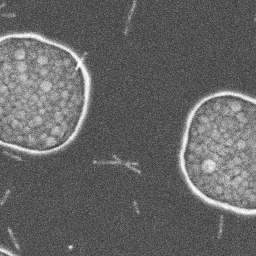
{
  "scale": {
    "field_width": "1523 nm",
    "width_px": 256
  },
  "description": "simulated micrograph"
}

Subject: holes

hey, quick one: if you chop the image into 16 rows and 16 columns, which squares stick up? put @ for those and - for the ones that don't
@@@@@@@@@@@@@@@@
@@@@@@@@@@@@@@@@
---@@@@@@@@@@@@@
-----@@@@@@@@@@@
-----@@@@@@@@@@@
-----@@@@@@@@@@@
-----@@@@@@@@---
-----@@@@@@@----
----@@@@@@@@----
@@@@@@@@@@@-----
@@@@@@@@@@@@----
@@@@@@@@@@@@----
@@@@@@@@@@@@@---
@@@@@@@@@@@@@@@@
@@@@@@@@@@@@@@@@
@@@@@@@@@@@@@@@@